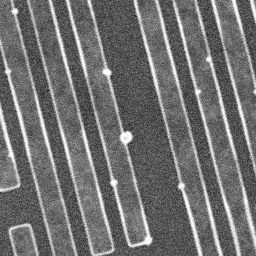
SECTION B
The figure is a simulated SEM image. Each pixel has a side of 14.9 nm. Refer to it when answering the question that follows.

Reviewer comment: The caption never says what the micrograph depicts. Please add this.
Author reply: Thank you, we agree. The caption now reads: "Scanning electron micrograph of groups of lines, slits or small figures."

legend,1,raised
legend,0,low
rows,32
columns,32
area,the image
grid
11001100111000000111001110011000
11001110011100000111001110011100
11001110011100000111001110011100
11001110011100000011000110011100
11100110011100000011100111001100
11100111001110000011100111001110
11100111001110000011100111001110
11100111001110000001110011001110
01110011000110000001110011100111
01110011100111000001110011100111
01110011100111000001110011100111
00110011100111000000111011100111
00111001110111000000111001110011
00111001110011100000111001110011
00111001110011100000111001110011
00011001110011100000011100110001
10011100110001110000011100111001
10011100111001110000011100111001
10011100111001110000011100111001
11001100111001110000001110011001
11001110011100110000001110011100
11001110011100111000001110011100
11001110011100111000001110011100
11000110011100111000000111001100
00000111001110011000000111001110
00000111001110011100000111001110
00000111001110011100000011000110
00000011001110011100000011100110
00110011100111001100000011100111
01110011100111001110000011100111
00110011100111001100000001100011
00111001100011000000000001110011